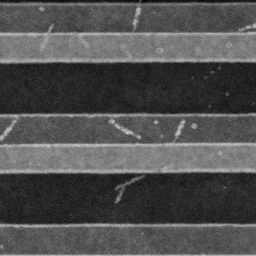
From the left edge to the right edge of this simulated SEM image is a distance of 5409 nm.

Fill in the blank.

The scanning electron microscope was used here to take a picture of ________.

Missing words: lines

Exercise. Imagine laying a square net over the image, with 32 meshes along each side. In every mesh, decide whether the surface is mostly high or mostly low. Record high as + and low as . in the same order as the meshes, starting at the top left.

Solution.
................................
++++++++++++++++++++++++++++++++
++++++++++++++++++++++++++++++++
++++++++++++++++++++++++++++++++
++++++++++++++++++++++++++++++++
++++++++++++++++++++++++++++++++
++++++++++++++++++++++++++++++++
++++++++++++++++++++++++++++++++
................................
................................
................................
................................
................................
................................
..+....................+++++..++
++++++++++++++++++++++++++++++++
++++++++++++++++++++++++++++++++
++++++++++++++++++++++++++++++++
++++++++++++++++++++++++++++++++
++++++++++++++++++++++++++++++++
++++++++++++++++++++++++++++++++
...................+............
................................
................................
................................
................................
................................
................................
++++++++++++++++++++++++++++++++
++++++++++++++++++++++++++++++++
++++++++++++++++++++++++++++++++
++++++++++++++++++++++++++++++++